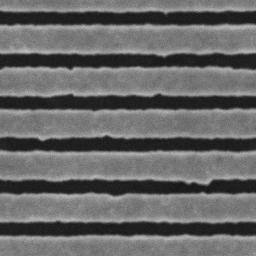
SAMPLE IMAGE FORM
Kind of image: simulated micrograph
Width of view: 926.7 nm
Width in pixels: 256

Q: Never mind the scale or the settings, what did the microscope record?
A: parallel lines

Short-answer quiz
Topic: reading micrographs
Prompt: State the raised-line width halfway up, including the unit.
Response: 27.5 px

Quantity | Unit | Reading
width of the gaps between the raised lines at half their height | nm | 53.9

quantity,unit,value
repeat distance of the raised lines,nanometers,153